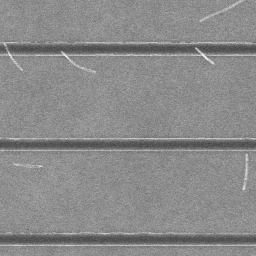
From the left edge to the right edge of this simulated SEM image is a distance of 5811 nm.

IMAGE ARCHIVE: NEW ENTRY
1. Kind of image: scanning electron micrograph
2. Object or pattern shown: lines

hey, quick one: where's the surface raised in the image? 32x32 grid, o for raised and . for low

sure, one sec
................................
................................
................................
................................
................................
oooooooooooooooooooooooooooooooo
oooooooooooooooooooooooooooooooo
................................
................................
................................
................................
................................
................................
................................
................................
................................
................................
oooooooooooooooooooooooooooooooo
oooooooooooooooooooooooooooooooo
................................
................................
................................
................................
................................
................................
................................
................................
................................
................................
oooooooooooooooooooooooooooooooo
oooooooooooooooooooooooooooooooo
................................